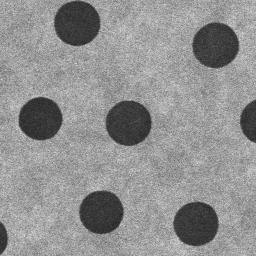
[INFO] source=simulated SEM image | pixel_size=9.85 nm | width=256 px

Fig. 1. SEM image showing holes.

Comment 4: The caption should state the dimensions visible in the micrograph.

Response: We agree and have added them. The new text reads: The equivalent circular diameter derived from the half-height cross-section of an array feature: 446 nanometers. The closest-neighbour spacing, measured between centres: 928 nm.